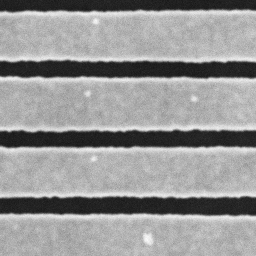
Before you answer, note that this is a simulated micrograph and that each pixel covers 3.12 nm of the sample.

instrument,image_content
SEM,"lines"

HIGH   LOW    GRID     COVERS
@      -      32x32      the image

--------------------------------
@--@@-@@@--@@-@@@@@@@@@@@@@@@@@@
@@@@@@@@@@@@@@@@@@@@@@@@@@@@@@@@
@@@@@@@@@@@@@@@@@@@@@@@@@@@@@@@@
@@@@@@@@@@@@@@@@@@@@@@@@@@@@@@@@
@@@@@@@@@@@@@@@@@@@@@@@@@@@@@@@@
@@@@@@@@@@@@@@@@@@@@@@@@@@@@@@@@
@@@@@@@@@@@@@@@@@@@@@@@@@@@@@@@@
--------------------------------
--------------------------------
@@@@@@@@@@@@@@@@@@@@@@@@@@@@@@@@
@@@@@@@@@@@@@@@@@@@@@@@@@@@@@@@@
@@@@@@@@@@@@@@@@@@@@@@@@@@@@@@@@
@@@@@@@@@@@@@@@@@@@@@@@@@@@@@@@@
@@@@@@@@@@@@@@@@@@@@@@@@@@@@@@@@
@@@@@@@@@@@@@@@@@@@@@@@@@@@@@@@@
--------------------------------
--------------------------------
@@@@@@@@@@@@@@@@@@@@@@@@@@@@@@@@
@@@@@@@@@@@@@@@@@@@@@@@@@@@@@@@@
@@@@@@@@@@@@@@@@@@@@@@@@@@@@@@@@
@@@@@@@@@@@@@@@@@@@@@@@@@@@@@@@@
@@@@@@@@@@@@@@@@@@@@@@@@@@@@@@@@
@@@@@@@@@@@@@@@@@@@@@@@@@@@@@@@@
@@@@@@@@@@@@@@@@@@@@@@@@@@@@@@@@
--------------------------------
--------------------------------
@@@@@@@@@@@@@@@@@@@@@@@@@@@@@@@@
@@@@@@@@@@@@@@@@@@@@@@@@@@@@@@@@
@@@@@@@@@@@@@@@@@@@@@@@@@@@@@@@@
@@@@@@@@@@@@@@@@@@@@@@@@@@@@@@@@
@@@@@@@@@@@@@@@@@@@@@@@@@@@@@@@@